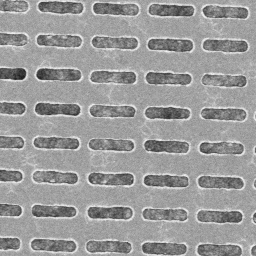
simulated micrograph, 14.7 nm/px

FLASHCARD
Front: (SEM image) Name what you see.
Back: a regular array of holes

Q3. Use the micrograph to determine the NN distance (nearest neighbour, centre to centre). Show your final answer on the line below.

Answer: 33.7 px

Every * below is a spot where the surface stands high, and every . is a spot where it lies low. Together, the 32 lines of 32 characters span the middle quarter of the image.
********************************
....****************************
....***...........***..........*
....***...........**............
*******...........***...........
********************************
********************************
********************************
***********.********************
********************************
....***..........***************
....**............**...........*
....***...........**............
***************..****..........*
********************************
********************************
********************************
********************************
...*****************************
....**...........***...........*
....**............**...........*
**.*****.........****..........*
********************************
********************************
********************************
********************************
********************************
...***...........***************
....**...........***...........*
...***...........***...........*
************.********..........*
********************************